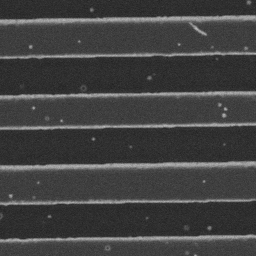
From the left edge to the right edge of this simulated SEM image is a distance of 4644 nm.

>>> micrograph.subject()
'lines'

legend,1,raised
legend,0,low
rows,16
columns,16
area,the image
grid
0000000000000000
1111111111111111
1111111111111111
1111111111100000
0000000000000000
0000000000000000
1111111111111111
1111111111111111
0000000000000000
0000000000000000
1111111111111111
1111111111111111
1111111111111111
0000000000000000
0000000000000000
1111111111111111